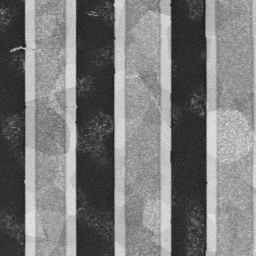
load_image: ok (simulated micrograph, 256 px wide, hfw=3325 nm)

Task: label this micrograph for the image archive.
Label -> one or a few lines or trenches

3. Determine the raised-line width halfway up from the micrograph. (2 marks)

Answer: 0.573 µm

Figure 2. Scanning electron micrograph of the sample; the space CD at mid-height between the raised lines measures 599 nanometres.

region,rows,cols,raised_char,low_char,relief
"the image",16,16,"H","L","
LLHHLLLHHHLLLHHH
LLHHLLLLHHLLLHHH
LLHHLLLHHHLLLHHH
LLHHLLLHHHLLLHHH
LLHHLLLHHHLLLHHH
LLHHLLLHHHLLLHHH
LLHHLLLHHHLLLHHH
LLHHLLLHHHLLLHHH
LLHHLLLHHHLLLHHH
LLHHLLLHHHLLLHHH
LLHHLLLHHHLLLHHH
LLHHLLLHHHLLLHHH
LLHHLLLHHHLLLHHH
LLHHLLLHHHLLLHHH
LLHHLLLHHHLLLHHH
LLHHLLLHHHLLLHHH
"